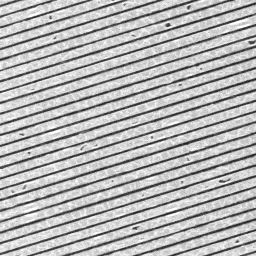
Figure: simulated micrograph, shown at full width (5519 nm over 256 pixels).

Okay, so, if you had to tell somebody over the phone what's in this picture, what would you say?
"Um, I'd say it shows parallel lines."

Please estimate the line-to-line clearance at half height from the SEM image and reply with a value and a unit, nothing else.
61.9 nanometres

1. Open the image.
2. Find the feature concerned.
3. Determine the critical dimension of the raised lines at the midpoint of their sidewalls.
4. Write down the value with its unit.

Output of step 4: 162 nanometres